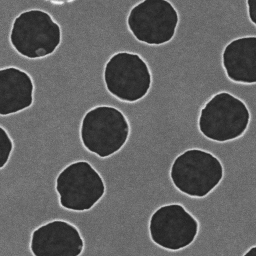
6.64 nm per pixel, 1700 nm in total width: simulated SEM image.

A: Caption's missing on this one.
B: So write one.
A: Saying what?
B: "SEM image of holes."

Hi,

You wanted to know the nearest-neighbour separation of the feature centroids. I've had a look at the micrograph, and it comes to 396 nanometres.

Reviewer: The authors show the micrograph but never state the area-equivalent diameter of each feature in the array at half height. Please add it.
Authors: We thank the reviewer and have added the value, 316 nm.